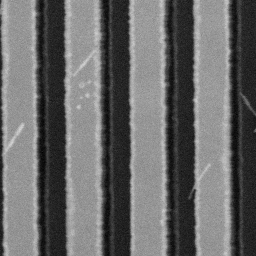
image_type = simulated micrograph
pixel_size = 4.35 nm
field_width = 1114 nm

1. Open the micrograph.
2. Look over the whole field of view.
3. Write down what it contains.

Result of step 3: lines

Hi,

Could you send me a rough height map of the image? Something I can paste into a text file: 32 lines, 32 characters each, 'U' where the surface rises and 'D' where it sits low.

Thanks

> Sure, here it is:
UUUUDDDDUUUUDDDDUUUUUDDDUUUUUDDD
UUUUDDDDUUUUUDDDUUUUUDDDUUUUUDDD
UUUUDDDDUUUUUDDDUUUUUDDDUUUUUDDD
UUUUDDDDUUUUUDDDUUUUUDDDUUUUUDDD
UUUUDDDDUUUUUDDDUUUUUDDDUUUUUDDD
UUUUDDDDUUUUDDDDUUUUUDDDUUUUUDDD
UUUUDDDDUUUUUDDDUUUUUDDDUUUUUDDD
UUUUUDDDUUUUUDDDUUUUUDDDUUUUUDDD
UUUUUDDDUUUUUDDDUUUUUDDDUUUUUDDD
UUUUDDDDUUUUUDDDUUUUUDDDUUUUUDDD
UUUUUDDDUUUUUDDDUUUUUDDDUUUUUDDD
UUUUUDDDUUUUUDDDUUUUUDDDUUUUUDDD
UUUUUDDDUUUUUDDDUUUUUDDDUUUUUDDD
UUUUUDDDUUUUUDDDUUUUUDDDUUUUUDDD
UUUUUDDDUUUUUDDDUUUUUDDDUUUUUDDD
UUUUUDDDUUUUUDDDUUUUUDDDUUUUUDDD
UUUUUDDDUUUUUDDDUUUUUDDDUUUUUDDD
UUUUUDDDUUUUUDDDUUUUUDDDUUUUUDDD
UUUUUDDDUUUUUDDDUUUUUDDDUUUUUDDD
UUUUUDDDUUUUUDDDUUUUUDDDUUUUUDDD
UUUUUDDDUUUUUDDDUUUUUDDDUUUUUDDD
UUUUUDDDUUUUUDDDUUUUUDDDUUUUUDDD
UUUUUDDDUUUUUDDDUUUUUDDDUUUUUDDD
UUUUUDDDUUUUUDDDUUUUUDDDUUUUUDDD
UUUUUDDDUUUUUDDDUUUUUDDDUUUUUDDD
UUUUUDDDUUUUUDDDUUUUUDDDUUUUUDDD
UUUUUDDDUUUUUDDDUUUUUDDDUUUUUDDD
UUUUUDDDUUUUUDDDUUUUUDDDUUUUUDDD
UUUUUDDDUUUUUDDDUUUUUDDDUUUUUDDD
UUUUUDDDUUUUUDDDUUUUUDDDUUUUUDDD
UUUUUDDDUUUUUDDDUUUUUDDDUUUUUDDD
UUUUUDDDUUUUUDDDUUUUUDDDDUUUUDDD